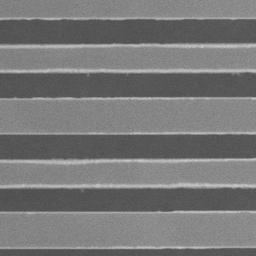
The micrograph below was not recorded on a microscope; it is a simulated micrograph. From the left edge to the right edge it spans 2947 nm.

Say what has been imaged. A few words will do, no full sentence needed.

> lines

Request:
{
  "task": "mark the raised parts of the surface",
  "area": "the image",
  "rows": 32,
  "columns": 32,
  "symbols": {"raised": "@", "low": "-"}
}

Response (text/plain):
@@@@@@@@@@@@@@@@@@@@@@@@@@@@@@@@
@@@@@@@@@@@@@@@@@@@@@@@@@@@@@@@@
--------------------------------
--------------------------------
--------------------------------
-------------------------------@
@@@@@@@@@@@@@@@@@@@@@@@@@@@@@@@@
@@@@@@@@@@@@@@@@@@@@@@@@@@@@@@@@
@@@@@@@@@@@@@@@@@@@@@@@@@@@@@@@@
--------------------------------
--------------------------------
--------------------------------
@@@@@@@@@@@@@@@@@@@@@@@@@@@@@@@@
@@@@@@@@@@@@@@@@@@@@@@@@@@@@@@@@
@@@@@@@@@@@@@@@@@@@@@@@@@@@@@@@@
@@@@@@@@@@@@@@@@@@@@@@@@@@@@@@@@
@@@@@@@@@@@@@@@@@@@@@@@@@@@@@@@@
--------------------------------
--------------------------------
--------------------------------
@@@@@@@@@@@@@@@@@@@@@@@@@@@@@@@@
@@@@@@@@@@@@@@@@@@@@@@@@@@@@@@@@
@@@@@@@@@@@@@@@@@@@@@@@@@@@@@@@@
@@@---@-@@@@@-@-----------------
--------------------------------
--------------------------------
-------------------@-@@@@@@@@@@@
@@@@@@@@@@@@@@@@@@@@@@@@@@@@@@@@
@@@@@@@@@@@@@@@@@@@@@@@@@@@@@@@@
@@@@@@@@@@@@@@@@@@@@@@@@@@@@@@@@
@@@@@@@@@@@@@@@@@@@@@@@@@@@@@@@@
--------------------------------